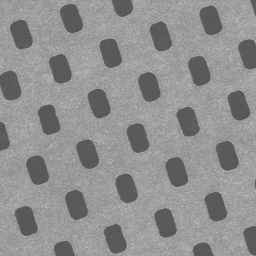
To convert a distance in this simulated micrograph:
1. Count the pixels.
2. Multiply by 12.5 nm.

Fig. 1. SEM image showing a regular array of holes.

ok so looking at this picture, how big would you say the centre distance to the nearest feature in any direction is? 0.644 microns